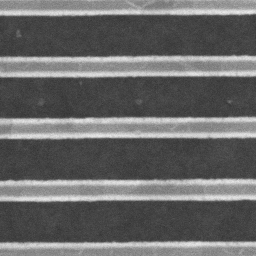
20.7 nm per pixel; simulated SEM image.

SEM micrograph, lines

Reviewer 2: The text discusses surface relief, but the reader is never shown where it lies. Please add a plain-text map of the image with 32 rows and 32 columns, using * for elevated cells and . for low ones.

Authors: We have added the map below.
********************************
********************************
................................
................................
................................
................................
................................
********************************
********************************
................................
................................
................................
................................
................................
................................
********************************
********************************
................................
................................
................................
................................
................................
................................
********************************
********************************
................................
................................
................................
................................
................................
..............*.****************
********************************